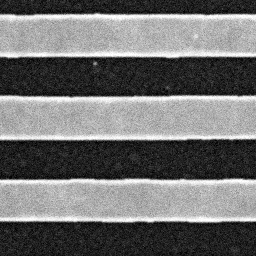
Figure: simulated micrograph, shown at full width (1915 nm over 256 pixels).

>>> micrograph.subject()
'lines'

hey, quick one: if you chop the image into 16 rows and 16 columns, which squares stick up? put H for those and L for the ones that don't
LLLLLLLLLLLLLLLL
HHHHHHHHHHHHHHHH
HHHHHHHHHHHHHHHH
LLLLLLLLLLLLLLLL
LLLLLLLLLLLLLLLL
LLLLLLLLLLLLLLLL
HHHHHHHHHHHHHHHH
HHHHHHHHHHHHHHHH
HHHHHHHHHHHHHHHH
LLLLLLLLLLLLLLLL
LLLLLLLLLLLLLLLL
HHHHHHHHHHHHHHHH
HHHHHHHHHHHHHHHH
HHHHHHHHHHHHHHHH
LLLLLLLLLLLLLLLL
LLLLLLLLLLLLLLLL